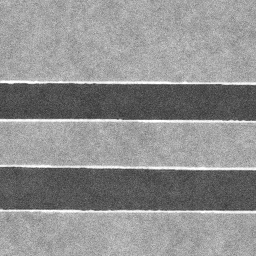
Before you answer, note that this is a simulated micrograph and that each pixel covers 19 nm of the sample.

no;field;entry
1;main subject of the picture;lines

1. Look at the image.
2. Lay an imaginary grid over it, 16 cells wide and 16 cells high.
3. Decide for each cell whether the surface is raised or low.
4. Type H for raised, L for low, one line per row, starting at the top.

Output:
HHHHHHHHHHHHHHHH
HHHHHHHHHHHHHHHH
HHHHHHHHHHHHHHHH
HHHHHHHHHHHHHHHH
HHHHHHHHHHHHHHHH
LLLLLLLLLLLLLLLL
LLLLLLLLLLLLLLLL
HHHLLLLLLLLLLLLL
HHHHHHHHHHHHHHHH
HHHHHHHHHHHHHHHH
LLLLLLLLLLLHHHHH
LLLLLLLLLLLLLLLL
LLLLLLLLLLLLLLLL
HHHHHHHHHHHHHHHH
HHHHHHHHHHHHHHHH
HHHHHHHHHHHHHHHH